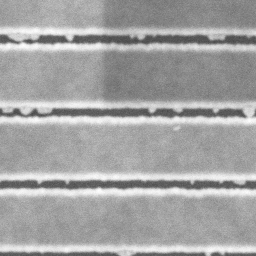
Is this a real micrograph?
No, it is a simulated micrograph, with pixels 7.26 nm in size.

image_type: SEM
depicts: lines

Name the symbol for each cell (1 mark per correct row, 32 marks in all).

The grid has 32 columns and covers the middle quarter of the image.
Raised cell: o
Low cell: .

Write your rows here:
oooooooooooooooooooooooooooooooo
oooooooooooooooooooooooooooooooo
oooooooooooooooooooooooooooooooo
oooooooooooooooooooooooooooooooo
oooooooooooooooooooooooooooooooo
oooooooooooooooooooooooooooooooo
oooooooooooooooooooooooooooooooo
oooooooooooooooooooooooooooooooo
oooooooooooooooooooooooooooooooo
oooooooooooooooooooooooooooooooo
oooooooooooooooooooooooooooooooo
................................
................................
oo.ooo.....o.......o...oo.......
oooooooooooooooooooooooooooooooo
oooooooooooooooooooooooooooooooo
oooooooooooooooooooooooooooooooo
oooooooooooooooooooooooooooooooo
oooooooooooooooooooooooooooooooo
oooooooooooooooooooooooooooooooo
oooooooooooooooooooooooooooooooo
oooooooooooooooooooooooooooooooo
oooooooooooooooooooooooooooooooo
oooooooooooooooooooooooooooooooo
oooooooooooooooooooooooooooooooo
oooooooooooooooooooooooooooooooo
oooooooooooooooooooooooooooooooo
oooooooooooooooooooooooooooooooo
oooooooooooooooooooooooooooooooo
................................
................................
.....oo.oo.oo...ooooooo...oooo..